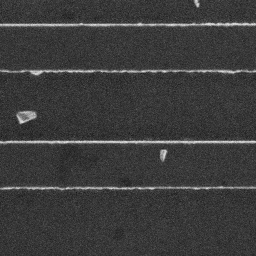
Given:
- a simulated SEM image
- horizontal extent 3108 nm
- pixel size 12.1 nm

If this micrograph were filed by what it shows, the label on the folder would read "lines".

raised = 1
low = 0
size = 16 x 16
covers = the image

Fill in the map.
0000000000000000
0000000000000000
1111111111111111
1111111111111111
0000000000000000
0000000000000000
0000000000000000
0000000000000000
0000000000000000
1111111111111111
1111111111111111
1111111111111111
0000000000000000
0000000000000000
0000000000000000
0000000000000000